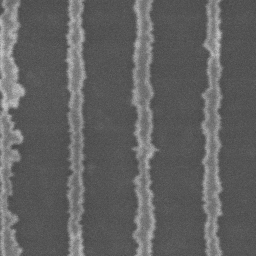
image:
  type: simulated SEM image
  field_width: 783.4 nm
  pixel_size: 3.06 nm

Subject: one or a few lines or trenches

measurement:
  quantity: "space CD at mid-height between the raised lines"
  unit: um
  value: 0.173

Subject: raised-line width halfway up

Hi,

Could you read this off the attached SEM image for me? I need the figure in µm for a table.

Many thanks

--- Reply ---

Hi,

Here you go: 0.0363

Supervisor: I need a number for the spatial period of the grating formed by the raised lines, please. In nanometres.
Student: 208